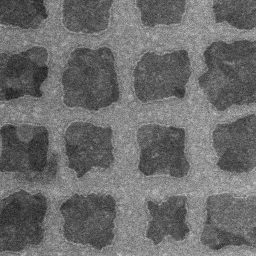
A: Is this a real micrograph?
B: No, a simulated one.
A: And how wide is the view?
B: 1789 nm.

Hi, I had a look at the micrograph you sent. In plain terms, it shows raised bodies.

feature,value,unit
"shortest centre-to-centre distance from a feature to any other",69.2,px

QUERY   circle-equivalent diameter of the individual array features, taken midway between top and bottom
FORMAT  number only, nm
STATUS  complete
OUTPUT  397